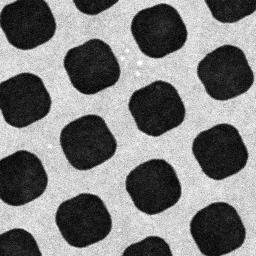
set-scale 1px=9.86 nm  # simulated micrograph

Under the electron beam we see a regular array of holes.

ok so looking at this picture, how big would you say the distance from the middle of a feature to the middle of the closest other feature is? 748 nm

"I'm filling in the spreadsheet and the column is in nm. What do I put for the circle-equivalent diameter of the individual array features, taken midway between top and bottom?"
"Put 539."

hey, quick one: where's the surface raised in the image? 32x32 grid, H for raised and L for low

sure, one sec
HLLLLLHHHLLLLLHHHHHHLHHHHHLLLLLL
LLLLLLHHHHLLLHHHHLLLLLHHHHLLLLLL
LLLLLLLHHHHHHHHHHLLLLLLHHHHLLLHH
LLLLLLLHHHHHHHHHLLLLLLLHHHHHHHHH
HLLLLLLHHHHHHHHHHLLLLLLHHHHHHHHH
HLLLLHHHHHLLLHHHHLLLLLLHHHHHHHHH
HHHHHHHHLLLLLLHHHHLLLLHHHHLLLLHH
HHHHHHHHLLLLLLLHHHHHHHHHHLLLLLLH
HHHHHHHHLLLLLLLHHHHHHHHHHLLLLLLH
HHLLLHHHHLLLLLLHHHHHHHHHHLLLLLLL
LLLLLLHHHLLLLLHHHHHLLHHHHLLLLLLL
LLLLLLHHHHLLHHHHHLLLLLHHHHLLLLLH
LLLLLLHHHHHHHHHHLLLLLLLHHHHLHHHH
LLLLLLHHHHHHHHHHLLLLLLLHHHHHHHHH
LLLLLLHHHHLLHHHHHLLLLLLHHHHHHHHH
HLLLHHHHLLLLLHHHHLLLLLLHHHHHLHHH
HHHHHHHHLLLLLLHHHHLLLHHHHLLLLLHH
HHHHHHHLLLLLLLHHHHHHHHHHLLLLLLHH
HHHHHHHHLLLLLLLHHHHHHHHHLLLLLLLH
HLLLLHHHLLLLLLHHHHHHHHHHLLLLLLLH
LLLLLHHHHLLLLHHHHHLLLHHHHLLLLLLH
LLLLLLHHHHHHHHHHLLLLLLHHHLLLLLHH
LLLLLLHHHHHHHHHHLLLLLLHHHHHHHHHH
LLLLLLHHHHHHHHHHLLLLLLLHHHHHHHHH
LLLLLHHHHLLLHHHHLLLLLLLHHHHHHHHH
HLLHHHHHLLLLLHHHHLLLLLHHHHLLLHHH
HHHHHHHLLLLLLLHHHHLLHHHHHLLLLLHH
HHHHHHHLLLLLLLHHHHHHHHHHLLLLLLHH
HHHHHHHLLLLLLLHHHHHHHHHHLLLLLLLH
LLLLHHHHLLLLLHHHHHHHHHHHLLLLLLLH
LLLLLHHHHLLLHHHHHLLLLHHHHLLLLLHH
LLLLLHHHHHHHHHHLLLLLLHHHHLLLLHHH